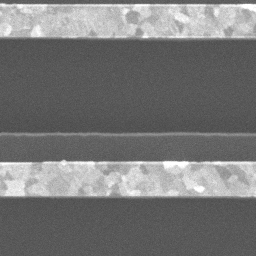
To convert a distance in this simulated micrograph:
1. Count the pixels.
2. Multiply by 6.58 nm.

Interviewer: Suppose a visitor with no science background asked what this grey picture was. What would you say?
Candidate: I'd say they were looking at lines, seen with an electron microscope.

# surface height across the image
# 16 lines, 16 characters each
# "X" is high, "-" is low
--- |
XXXXXXXXXXXXXXXX
XXXXXXXXXXXXXXXX
----------------
----------------
----------------
----------------
----------------
----------------
XXXXXXXXXXXXXXXX
XXXXXXXXXXXXXXXX
XXXXXXXXXXXXXXXX
XXXXXXXXXXXXXXXX
----------------
----------------
----------------
----------------